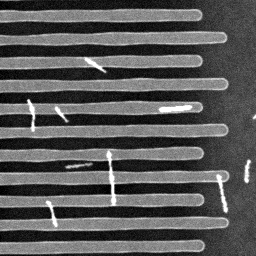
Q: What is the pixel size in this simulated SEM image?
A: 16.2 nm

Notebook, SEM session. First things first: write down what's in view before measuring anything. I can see groups of lines, slits or small figures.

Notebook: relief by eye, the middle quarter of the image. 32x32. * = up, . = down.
********************************
................................
................................
................................
********************************
********************************
.......***************..........
................................
................................
...............******...........
********************************
********************************
...............*****............
................................
................................
...............*****************
********************************
********************************
................................
................................
................................
......********....**************
********************************
********************************
................................
................................
...........*....................
********************************
********************************
*******************************.
................................
................................